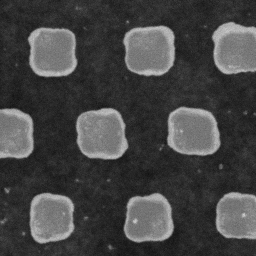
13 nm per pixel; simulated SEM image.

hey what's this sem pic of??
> raised bodies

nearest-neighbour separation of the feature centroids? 1.21 um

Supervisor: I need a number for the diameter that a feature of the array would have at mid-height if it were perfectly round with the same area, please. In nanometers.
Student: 649